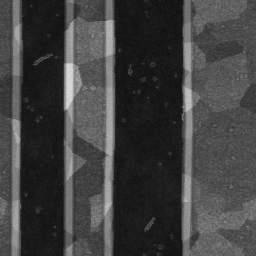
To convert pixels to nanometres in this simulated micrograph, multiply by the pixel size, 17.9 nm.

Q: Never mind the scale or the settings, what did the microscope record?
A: one or a few lines or trenches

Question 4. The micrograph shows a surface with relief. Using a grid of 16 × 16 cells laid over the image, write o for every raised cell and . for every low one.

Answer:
o...ooo.....oooo
o...ooo.....oooo
o...ooo.....oooo
o...ooo.....oooo
o...ooo.....oooo
o...ooo.....oooo
o...ooo.....oooo
o...ooo.....oooo
o...ooo.....oooo
o...ooo.....oooo
o...ooo.....oooo
o...ooo.....oooo
o...ooo.....oooo
o...ooo.....oooo
o...ooo.....oooo
o...ooo.....oooo